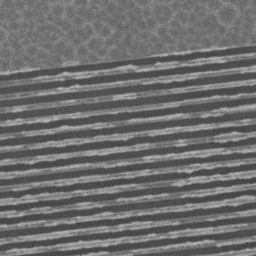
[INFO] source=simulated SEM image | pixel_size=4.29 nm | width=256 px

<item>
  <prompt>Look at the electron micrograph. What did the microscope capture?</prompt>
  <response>parallel lines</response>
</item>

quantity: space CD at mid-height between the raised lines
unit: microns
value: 0.033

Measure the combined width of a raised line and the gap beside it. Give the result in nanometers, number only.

55.7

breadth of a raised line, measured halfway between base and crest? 5.2 px